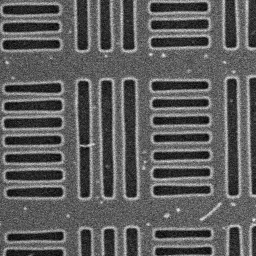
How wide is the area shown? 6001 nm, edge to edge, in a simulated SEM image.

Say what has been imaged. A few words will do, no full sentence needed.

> groups of lines, slits or small figures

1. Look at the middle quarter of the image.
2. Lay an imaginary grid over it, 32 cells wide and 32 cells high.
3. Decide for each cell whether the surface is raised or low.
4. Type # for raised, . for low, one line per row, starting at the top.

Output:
################################
################################
################################
################################
###...###...###...####..........
###...###...###...####..........
###...###...###...####..........
###....##...###...##############
###....##...###...#####..####...
###....##...###...####..........
###....##...###...####..........
###....##...###...##############
###....##...###...##############
###....##...###...####..........
###....##...###...####..........
###....##...###...##############
###....##...###...##############
###....##...###...#####.........
###....##...###...####..........
###....##...###...#####.........
####..###...###...##############
####...##...###...##############
####...##...###...####..........
####...##....##...####..........
####...##....##...##############
####...##....##...##############
####...##....##...####..........
####...##....##...####..........
####...##....##...####......####
####...##....##....#############
####...###...##....###..........
####...###...##....###..........